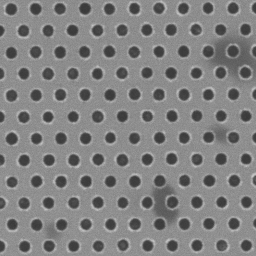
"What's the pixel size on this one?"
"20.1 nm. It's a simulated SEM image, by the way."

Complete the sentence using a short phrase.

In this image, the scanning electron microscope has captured a regular array of raised bodies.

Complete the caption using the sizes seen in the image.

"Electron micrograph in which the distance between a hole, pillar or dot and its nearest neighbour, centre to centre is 490 nm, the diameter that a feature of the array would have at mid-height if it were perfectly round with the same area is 0.279 um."